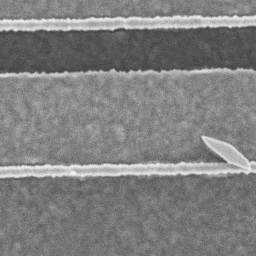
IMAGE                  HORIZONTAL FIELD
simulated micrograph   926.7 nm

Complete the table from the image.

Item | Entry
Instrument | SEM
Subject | lines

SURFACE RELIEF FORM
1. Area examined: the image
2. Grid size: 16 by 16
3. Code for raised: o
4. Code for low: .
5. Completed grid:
oooooooooooooooo
oooooooooooooooo
................
................
.....ooooooooooo
oooooooooooooooo
oooooooooooooooo
oooooooooooooooo
oooooooooooooooo
oooooooooooooooo
oooooooooooooooo
................
................
................
................
................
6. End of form